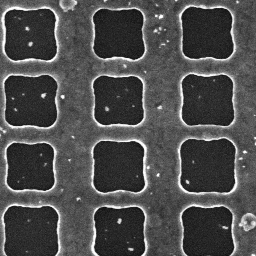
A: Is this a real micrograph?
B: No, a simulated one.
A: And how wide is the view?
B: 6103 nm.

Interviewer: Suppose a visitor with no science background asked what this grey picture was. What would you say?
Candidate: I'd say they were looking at a regular array of holes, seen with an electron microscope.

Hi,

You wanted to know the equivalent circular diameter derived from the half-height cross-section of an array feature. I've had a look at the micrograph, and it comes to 56.6 px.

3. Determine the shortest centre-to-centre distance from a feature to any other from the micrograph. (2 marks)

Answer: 1580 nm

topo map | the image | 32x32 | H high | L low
HHHHHHHHHHHHHHHHHHHHHHHHHHHHHHHH
HLLLLLLHHHHHLLLLLLHHHHHLLLLLLHHH
LLLLLLLHHHHHLLLLLLHHHHHLLLLLLHHH
HLLLLLLHHHHHLLLLLLHHHHHLLLLLLHHH
HLLLLLLHHHHHLLLLLLHHHHHLLLLLLHHH
HLLLLLLHHHHHLLLLLLHHHHHLLLLLLHHH
HLLLLLLHHHHHLLLLLLHHHHHLLLLLLHHH
HHLHHLHHHHHHHHHHHHHHHHHHHHHHHHHH
HHHHHHHHHHHHHHHHHHHHHHHHHHHHHHHH
HLLLHLHHHHHHHLHHHHHHHHHLLHHLLHHH
HLLLLLLHHHHHLLLLLLHHHHHLLLLLLHHH
HLLLLLLHHHHHLLLLLLHHHHHLLLLLLHHH
HLLLLLLHHHHHLLLLLLHHHHHLLLLLLHHH
HLLLLLLHHHHHLLLLLLHHHHHLLLLLLHHH
HLLLLLLHHHHHLLLLLLHHHHHLLLLLLHHH
HLLLLLLHHHHHHLLLLHHHHHHLLLLLLHHH
HHHHHHHHHHHHHHHHHHHHHHHHHHHHHHHH
HHHHHHHHHHHHHHHHHHHHHHHLLLLLLHHH
HLLLLLLHHHHHLLLLLLHHHHHLLLLLLHHH
HLLLLLLHHHHHLLLLLLHHHHHLLLLLLHHH
HLLLLLLHHHHHLLLLLLHHHHHLLLLLLHHH
HLLLLLLHHHHHLLLLLLHHHHHLLLLLLHHH
HLLLLLLHHHHHLLLLLLHHHHLLLLLLLHHH
HLLLLLHHHHHHLLLLLLHHHHHLLLLLLHHH
HHHHHHHHHHHHHHHHHHHHHHHHHHHHHHHH
HHHHHHHHHHHHHHHHHHHHHHHHHHHHHHHH
HLLLLLLHHHHHLLLLLLHHHHHLLLLLLHHH
LLLLLLLHHHHHLLLLLLHHHHHLLLLLLHHH
HLLLLLLHHHHHLLLLLLHHHHHLLLLLLHHH
HLLLLLLHHHHHLLLLLLHHHHHLLLLLLHHH
HLLLLLLHHHHHLLLLLLHHHHHLLLLLLHHH
HLLLLLLHHHHHLLLLLLHHHHHLLLLLLHHH